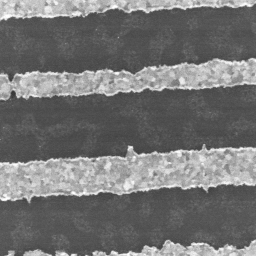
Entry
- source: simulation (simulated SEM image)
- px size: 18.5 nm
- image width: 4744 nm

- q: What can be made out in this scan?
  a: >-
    one or a few lines or trenches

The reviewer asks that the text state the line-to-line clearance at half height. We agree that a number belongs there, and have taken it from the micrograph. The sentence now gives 1150 nm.